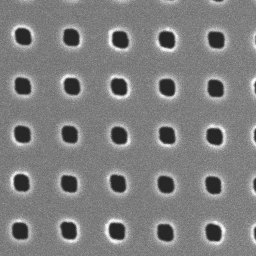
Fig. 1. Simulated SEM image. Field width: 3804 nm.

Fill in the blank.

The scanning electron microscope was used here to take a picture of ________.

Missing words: a regular array of holes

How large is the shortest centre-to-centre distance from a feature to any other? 0.705 microns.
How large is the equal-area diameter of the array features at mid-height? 270 nanometres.